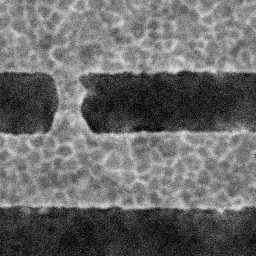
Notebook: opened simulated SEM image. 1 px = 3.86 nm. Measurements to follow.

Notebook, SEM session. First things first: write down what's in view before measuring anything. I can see one or a few lines or trenches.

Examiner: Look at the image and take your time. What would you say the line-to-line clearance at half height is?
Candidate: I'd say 238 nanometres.